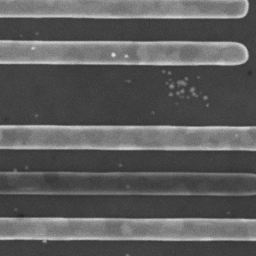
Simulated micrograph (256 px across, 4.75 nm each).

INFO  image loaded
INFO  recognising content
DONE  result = wiring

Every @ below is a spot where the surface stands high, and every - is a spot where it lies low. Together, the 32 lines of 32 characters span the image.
@@@@@@@@@@@@@@@@@@@@@@@@@@@@@@@-
@@@@@@@@@@@@@@@@@@@@@@@@@@@@@@@-
--------------------------------
--------------------------------
--------------------------------
@@@@@@@@@@@@@@@@@@@@@@@@@@@@@@--
@@@@@@@@@@@@@@@@@@@@@@@@@@@@@@@-
@@@@@@@@@@@@@@@@@@@@@@@@@@@@@@@-
--------------------------------
--------------------------------
--------------------------------
--------------------------------
--------------------------------
--------------------------------
--------------------------------
--------------------------------
@@@@@@@@@@@@@@@@@@@@@@@@@@@@@@@@
@@@@@@@@@@@@@@@@@@@@@@@@@@@@@@@@
-@@@@@@@@@@@@@@@@@@@@@@@@@@@@@@@
--------------------------------
--------------------------------
--------------------------------
@@@@@@@@@@@@@@@@@@@@@@@@@@@@@@@@
@@@@@@@@@@@@@@@@@@@@@@@@@@@@@@@@
--------------------------------
--------------------------------
--------------------------------
@@@@@@@@@@@@@@@@@@@@@@@@@@@@@@@-
@@@@@@@@@@@@@@@@@@@@@@@@@@@@@@@@
@@@@@@@@@@@@@@@@@@@@@@@@@@@@@@@@
--------------------------------
--------------------------------